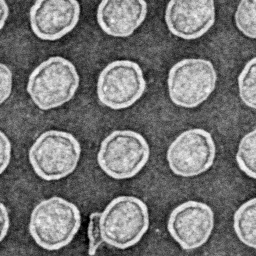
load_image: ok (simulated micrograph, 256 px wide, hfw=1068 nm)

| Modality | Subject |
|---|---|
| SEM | a regular array of raised bodies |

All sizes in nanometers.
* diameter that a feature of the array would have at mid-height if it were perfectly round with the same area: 198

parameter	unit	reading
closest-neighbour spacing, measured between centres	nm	285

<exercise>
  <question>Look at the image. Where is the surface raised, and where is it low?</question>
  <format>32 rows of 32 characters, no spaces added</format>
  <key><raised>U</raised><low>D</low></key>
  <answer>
UDDDUUUUUUDDDUUUUUDDDUUUUUUDDDUU
UDDDUUUUUUDDUUUUUUDDDUUUUUUDDDUU
UDDDUUUUUUDDUUUUUUDDDUUUUUUDDDUU
DDDDUUUUUDDDDUUUUDDDDUUUUUDDDDUU
DDDDDUUUDDDDDDDDDDDDDDUUUDDDDDDU
DDDDDDDDDDDDDDDDDDDDDDDDDDDDDDDD
DDDDDDDDDDDDDDDDDDDDDDDDDDDDDDDD
DDDDDDUUDDDDDDDDDDDDDDDDDDDDDDDD
UDDDDUUUUDDDDUUUUDDDDDUUUUUDDDDU
UDDDUUUUUUDDDUUUUUDDDUUUUUUDDDUU
UDDDUUUUUUDDUUUUUUDDDUUUUUUDDDUU
UDDDUUUUUDDDUUUUUUDDDUUUUUDDDDUU
DDDDUUUUDDDDDUUUUDDDDDUUUDDDDDUU
DDDDDUDDDDDDDDDDDDDDDDDDDDDDDDDD
DDDDDDDDDDDDDDDDDDDDDDDDDDDDDDDD
DDDDDDDDDDDDDDDDDDDDDDDDDDDDDDDD
DDDDDDDDDDDDDDDUDDDDDDDDUUDDDDDD
UDDDDUUUUDDDDUUUUUDDDDUUUUDDDDUU
UDDDUUUUUUDDDUUUUUDDDUUUUUUDDDUU
UDDDUUUUUUDDUUUUUUDDDUUUUUUDDDUU
UDDDUUUUUDDDDUUUUUDDDUUUUUDDDDUU
DDDDDUUUUDDDDUUUUDDDDDUUUDDDDDDU
DDDDDDDDDDDDDDDDDDDDDDDDDDDDDDDD
DDDDDDDDDDDDDDDDDDDDDDDDDDDDDDDD
DDDDDDDDDDDDDDDDDDDDDDDDDDDDDDDD
DDDDDUUUUDDDDDUUUUDDDDDUUDDDDDDU
UDDDUUUUUUDDDUUUUUDDDDUUUUDDDDUU
UDDDUUUUUUDDDUUUUUDDDUUUUUDDDUUU
UDDDUUUUUUDUDUUUUUDDDUUUUUDDDUUU
DDDDUUUUUDDUDUUUUUDDDDUUUUDDDDUU
DDDDDUUUDDDDDDUUUDDDDDDUUDDDDDDU
DDDDDDDDDDDUDDDDDDDDDDDDDDDDDDDD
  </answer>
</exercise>